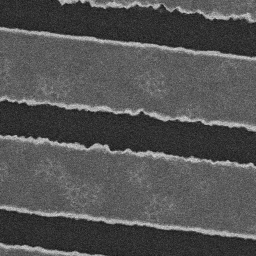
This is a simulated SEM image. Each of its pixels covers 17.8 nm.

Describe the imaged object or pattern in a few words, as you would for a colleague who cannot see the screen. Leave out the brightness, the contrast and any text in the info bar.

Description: one or a few lines or trenches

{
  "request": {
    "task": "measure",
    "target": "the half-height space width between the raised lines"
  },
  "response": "674 nm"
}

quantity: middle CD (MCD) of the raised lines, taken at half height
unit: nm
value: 1230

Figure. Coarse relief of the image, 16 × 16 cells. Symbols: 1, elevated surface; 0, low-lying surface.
0000000000111111
0000000000000000
1111110000000000
1111111111111100
1111111111111111
1111111111111111
0001111111111111
0000000000001111
0000000000000000
1111111100000000
1111111111111111
1111111111111111
1111111111111111
0000011111111111
0000000000000111
1100000000000000